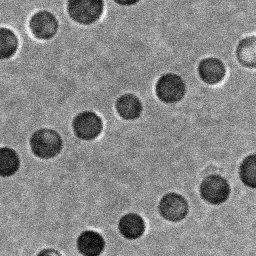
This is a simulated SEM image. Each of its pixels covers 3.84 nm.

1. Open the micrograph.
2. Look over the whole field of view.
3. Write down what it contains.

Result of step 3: a regular array of holes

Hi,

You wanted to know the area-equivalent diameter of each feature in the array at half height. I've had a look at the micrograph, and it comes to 118 nm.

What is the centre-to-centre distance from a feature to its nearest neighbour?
174 nm